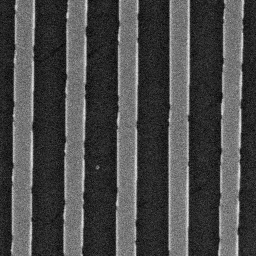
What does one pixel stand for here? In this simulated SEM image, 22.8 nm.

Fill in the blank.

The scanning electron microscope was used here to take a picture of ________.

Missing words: lines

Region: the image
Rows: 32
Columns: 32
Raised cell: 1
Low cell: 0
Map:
00110000011000011000011100001100
00110000111000011000011100001100
00110000111000011000011100001100
00110000111000011000011100001100
00110000111000011000011100001100
00110000111000011000011100001100
00110000111000011000011100001100
00110000111000011000011100001100
00110000111000011000011100001100
00110000111000011000011100001100
00110000111000011000011100001100
00110000111000011000011000001100
00110000111000011000011000001100
00110000111000011000011000001100
00110000111000011000011000001100
00110000111000011000011000001100
00110000110000011000011000001100
00110000110000011000011000001100
00110000110000011000011000001100
00110000110000011000011000001100
00110000110000011000011000001100
00110000110000011000011000001100
00110000110000011000011000001100
00110000110000011000011000001100
00110000110000011000011000001100
00110000110000011000011000001100
00110000110000011000011000001100
00110000110000011000011000001100
00110000110000011000011000001100
00110000110000011000011000001100
00110000110000011000011000011100
00110000110000011000011000011100